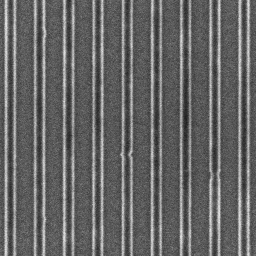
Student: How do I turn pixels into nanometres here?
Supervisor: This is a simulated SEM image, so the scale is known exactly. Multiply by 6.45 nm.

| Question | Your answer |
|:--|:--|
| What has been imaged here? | parallel lines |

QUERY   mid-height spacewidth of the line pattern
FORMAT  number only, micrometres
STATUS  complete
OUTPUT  0.125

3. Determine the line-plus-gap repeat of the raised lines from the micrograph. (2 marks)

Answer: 188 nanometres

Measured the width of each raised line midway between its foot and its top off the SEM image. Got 62 nm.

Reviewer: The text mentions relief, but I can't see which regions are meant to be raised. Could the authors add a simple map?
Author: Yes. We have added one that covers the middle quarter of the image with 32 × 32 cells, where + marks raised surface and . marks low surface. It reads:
++.....+++.....++.....++.....++.
++.....+++.....++.....++.....++.
++.....+++.....++.....++.....++.
++.....+++.....++.....++.....++.
++.....+++.....++.....++.....++.
++.....+++.....++.....++.....++.
++.....+++.....++.....++.....++.
++.....+++.....++.....++.....++.
++.....+++.....++.....++.....++.
++.....+++.....++.....++.....++.
++.....+++.....++.....++.....++.
++.....+++.....++.....++.....++.
++.....+++.....++.....++.....++.
++.....+++.....++.....++.....++.
++.....+++.....++.....++.....++.
++.....+++.....++.....++.....++.
++.....+++.....++.....++.....++.
++.....+++.....++.....++.....++.
++.....+++.....++.....++.....++.
++.....+++.....++.....++.....++.
++.....+++.....++.....++.....++.
++.....+++.....++.....++.....++.
++.....+++....+++.....++.....++.
++.....+++....+++.....++.....++.
++.....+++.....++.....++.....++.
++.....+++.....++.....++.....++.
++.....++......++.....++.....++.
++.....+++.....++.....++.....++.
++.....+++.....++.....++.....++.
++.....+++.....++.....++.....++.
++.....+++.....++.....++.....++.
++.....++......++.....++.....++.